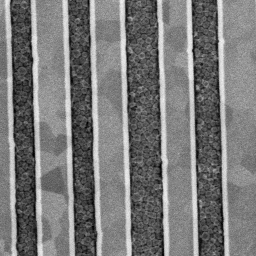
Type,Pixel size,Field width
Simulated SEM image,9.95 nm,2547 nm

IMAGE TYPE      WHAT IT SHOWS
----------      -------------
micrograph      one or a few lines or trenches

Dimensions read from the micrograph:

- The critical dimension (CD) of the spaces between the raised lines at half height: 277 nm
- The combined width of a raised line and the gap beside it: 622 nm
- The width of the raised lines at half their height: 31.2 pixels